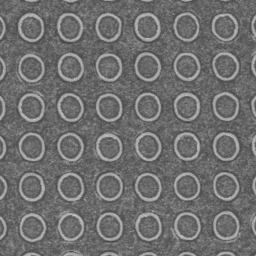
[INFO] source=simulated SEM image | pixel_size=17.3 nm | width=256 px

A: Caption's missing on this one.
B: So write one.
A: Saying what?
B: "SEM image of a regular array of raised bodies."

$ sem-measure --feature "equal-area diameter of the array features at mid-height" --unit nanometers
432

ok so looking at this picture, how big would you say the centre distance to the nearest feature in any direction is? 669 nm